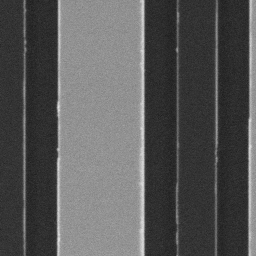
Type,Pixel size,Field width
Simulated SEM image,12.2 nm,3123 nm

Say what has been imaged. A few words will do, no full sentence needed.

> lines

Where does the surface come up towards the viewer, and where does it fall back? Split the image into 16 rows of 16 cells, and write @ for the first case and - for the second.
@@--@@@@@--@@@--
@@--@@@@@--@@@--
@@--@@@@@--@@@--
@@--@@@@@--@@@--
@@--@@@@@--@@@--
@@--@@@@@--@@@--
@@--@@@@@--@@@--
@@--@@@@@--@@@--
@@--@@@@@--@@@--
@@--@@@@@--@@---
@@--@@@@@--@@---
@@--@@@@@--@@---
@@--@@@@@--@@---
@@--@@@@@--@@---
@@--@@@@@--@@---
@@--@@@@@--@@---